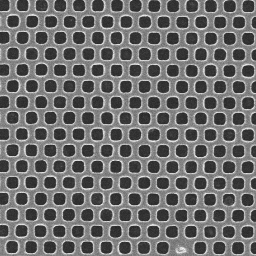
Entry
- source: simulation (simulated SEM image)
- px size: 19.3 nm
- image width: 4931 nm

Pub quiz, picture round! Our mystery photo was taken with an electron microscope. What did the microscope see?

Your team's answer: a regular array of holes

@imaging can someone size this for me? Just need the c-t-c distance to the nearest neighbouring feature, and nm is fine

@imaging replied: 352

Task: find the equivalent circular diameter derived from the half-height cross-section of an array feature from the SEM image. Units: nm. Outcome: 248